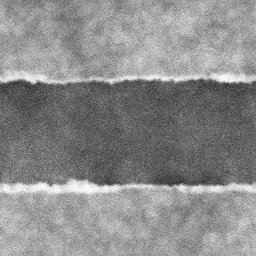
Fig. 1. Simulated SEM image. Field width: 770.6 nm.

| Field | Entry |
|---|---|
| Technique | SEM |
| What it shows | one or a few lines or trenches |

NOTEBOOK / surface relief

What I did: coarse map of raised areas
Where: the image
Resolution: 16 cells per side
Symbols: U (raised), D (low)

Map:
UUUUUUUUUUUUUUUU
UUUUUUUUUUUUUUUU
UUUUUUUUUUUUUUUU
UUUUUUUUUUUUUUUU
UUUUUUUUUUUUUUUU
DDDDDDDDDDDDDDDD
DDDDDDDDDDDDDDDD
DDDDDDDDDDDDDDDD
DDDDDDDDDDDDDDDD
DDDDDDDDDDDDDDDD
DDDDDDDDDDDDDDDD
DDUDUUDDDDDDDDDD
UUUUUUUUUUUUUUUU
UUUUUUUUUUUUUUUU
UUUUUUUUUUUUUUUU
UUUUUUUUUUUUUUUU